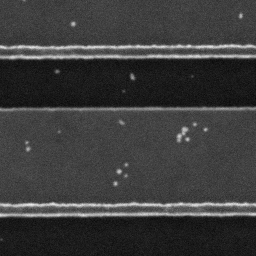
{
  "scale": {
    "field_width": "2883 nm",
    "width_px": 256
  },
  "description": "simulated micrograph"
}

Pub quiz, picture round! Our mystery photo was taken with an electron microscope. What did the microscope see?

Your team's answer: lines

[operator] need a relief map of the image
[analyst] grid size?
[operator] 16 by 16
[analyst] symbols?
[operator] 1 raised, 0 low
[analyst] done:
1111111111111111
1111111111111111
1111111111111111
1111111111111111
0000000000000000
0000000000000000
0000000000000000
1111111111111111
1111111111111111
1111111111111111
1111111111111111
1111111111111111
1111111111111111
0000000000000000
0000000000000000
0000000000000000